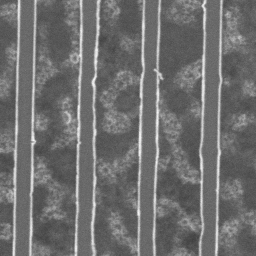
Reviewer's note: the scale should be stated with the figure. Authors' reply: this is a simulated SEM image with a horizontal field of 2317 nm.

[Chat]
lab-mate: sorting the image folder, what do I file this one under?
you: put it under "one or a few lines or trenches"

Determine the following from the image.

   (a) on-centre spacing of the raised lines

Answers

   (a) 61.9 px